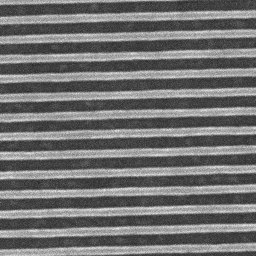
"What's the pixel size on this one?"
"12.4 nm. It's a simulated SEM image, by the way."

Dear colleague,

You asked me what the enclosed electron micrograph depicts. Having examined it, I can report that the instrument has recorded parallel lines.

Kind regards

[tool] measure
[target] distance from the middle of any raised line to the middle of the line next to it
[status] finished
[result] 241 nm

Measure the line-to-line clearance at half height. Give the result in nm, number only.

154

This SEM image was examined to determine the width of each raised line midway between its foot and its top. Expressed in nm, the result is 86.9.